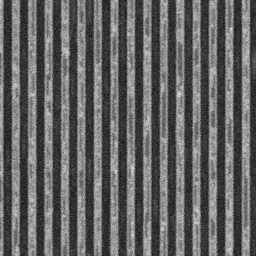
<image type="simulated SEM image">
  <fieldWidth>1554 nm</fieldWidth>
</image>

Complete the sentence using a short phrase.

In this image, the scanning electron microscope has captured parallel lines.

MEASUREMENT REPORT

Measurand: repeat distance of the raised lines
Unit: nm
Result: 99.8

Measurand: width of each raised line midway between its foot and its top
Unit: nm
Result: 37.2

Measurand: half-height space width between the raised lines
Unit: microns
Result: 0.0584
